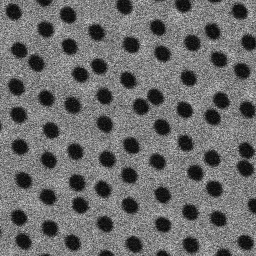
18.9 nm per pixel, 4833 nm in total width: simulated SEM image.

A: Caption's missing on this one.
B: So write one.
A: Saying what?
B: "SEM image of a regular array of holes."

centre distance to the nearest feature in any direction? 517 nanometres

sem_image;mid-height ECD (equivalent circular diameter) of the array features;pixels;16.5